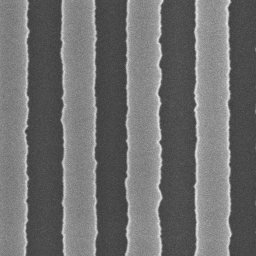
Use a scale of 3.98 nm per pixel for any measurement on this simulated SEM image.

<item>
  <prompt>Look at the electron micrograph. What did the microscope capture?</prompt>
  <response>lines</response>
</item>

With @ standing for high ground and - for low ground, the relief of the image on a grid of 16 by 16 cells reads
@@--@@--@@--@@--
@@--@@--@@--@@--
@@--@@--@@--@@--
@@--@@--@@--@@--
@@--@@--@@--@@--
@@--@@--@@--@@--
@@--@@--@@--@@--
@@--@@--@@--@@--
@@--@@--@@--@@--
@@--@@--@@--@@--
@@--@@--@@--@@--
@@--@@--@@--@@--
@@--@@--@@--@@--
@@--@@--@@--@@--
@@--@@--@@--@@--
@@--@@--@@--@@--